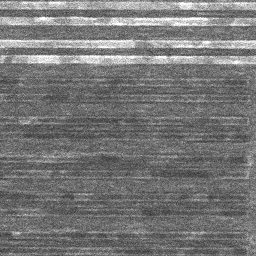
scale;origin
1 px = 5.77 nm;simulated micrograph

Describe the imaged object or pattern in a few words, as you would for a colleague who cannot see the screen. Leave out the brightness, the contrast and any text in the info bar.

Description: parallel lines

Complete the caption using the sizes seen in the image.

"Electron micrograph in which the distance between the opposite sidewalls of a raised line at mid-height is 40.4 nanometers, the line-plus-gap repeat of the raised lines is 0.109 micrometres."